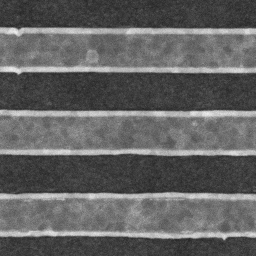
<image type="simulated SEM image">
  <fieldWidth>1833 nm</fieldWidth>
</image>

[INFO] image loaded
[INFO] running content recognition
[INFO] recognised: one or a few lines or trenches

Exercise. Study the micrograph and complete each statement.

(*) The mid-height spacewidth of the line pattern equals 309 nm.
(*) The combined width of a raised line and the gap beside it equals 591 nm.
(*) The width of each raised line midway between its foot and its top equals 284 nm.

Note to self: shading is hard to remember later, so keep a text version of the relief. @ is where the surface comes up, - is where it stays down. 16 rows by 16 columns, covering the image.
----------------
----------------
@@@@@@@@@@@@@@@@
@@@@@@@@@@@@@@@@
----------------
----------------
----------------
@@@@@@@@@@@@@@@@
@@@@@@@@@@@@@@@@
@@@@-@@@-@@@@@@@
----------------
----------------
@@@@@@@@@@@@@@@@
@@@@@@@@@@@@@@@@
@@@@@@@@@@@@@@@@
----------------